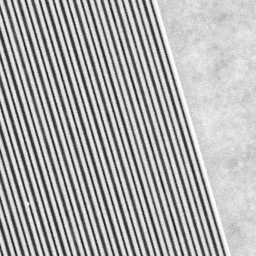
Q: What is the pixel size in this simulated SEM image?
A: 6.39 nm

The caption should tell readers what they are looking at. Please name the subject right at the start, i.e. parallel lines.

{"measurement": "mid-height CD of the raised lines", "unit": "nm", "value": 24.5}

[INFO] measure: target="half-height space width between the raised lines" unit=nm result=18.4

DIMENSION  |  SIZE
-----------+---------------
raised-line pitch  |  42.5 nanometres